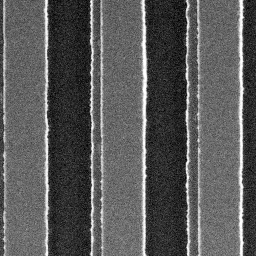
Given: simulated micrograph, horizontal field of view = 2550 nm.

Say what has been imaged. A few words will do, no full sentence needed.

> lines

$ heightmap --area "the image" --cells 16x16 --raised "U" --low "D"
UUUDDDUUUDDDUUUD
UUUDDDUUUDDDUUUD
UUUDDDUUUDDDUUUD
UUUDDDUUUDDDUUUD
UUUDDDUUUDDDUUUD
UUUDDDUUUDDDUUUD
UUUDDDUUUDDDUUUD
UUUDDDUUUDDDUUUD
UUUDDDUUUDDDUUUD
UUUDDDUUUDDDUUUD
UUUDDDUUUDDDUUUD
UUUDDDUUUDDDUUUD
UUUDDDUUUDDDUUUD
UUUDDDUUUDDDUUUD
UUUDDDUUUDDDUUUD
UUUDDDUUUDDDUUUD